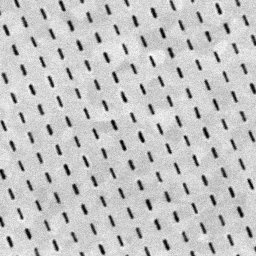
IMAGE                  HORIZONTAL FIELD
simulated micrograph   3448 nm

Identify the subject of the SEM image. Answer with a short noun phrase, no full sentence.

a regular array of holes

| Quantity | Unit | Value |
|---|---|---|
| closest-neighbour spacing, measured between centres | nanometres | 271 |